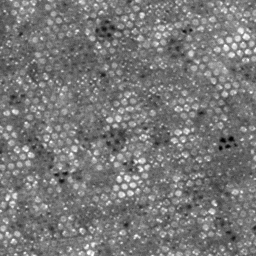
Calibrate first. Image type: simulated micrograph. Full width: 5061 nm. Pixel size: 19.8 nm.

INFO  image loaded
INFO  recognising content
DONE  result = a regular array of raised bodies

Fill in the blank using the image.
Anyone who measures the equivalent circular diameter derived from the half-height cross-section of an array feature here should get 86.4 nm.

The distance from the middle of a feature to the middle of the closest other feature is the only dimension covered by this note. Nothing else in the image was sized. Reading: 167 nanometers